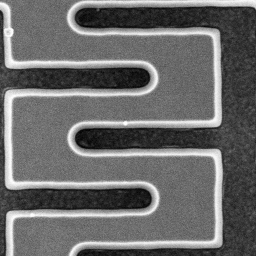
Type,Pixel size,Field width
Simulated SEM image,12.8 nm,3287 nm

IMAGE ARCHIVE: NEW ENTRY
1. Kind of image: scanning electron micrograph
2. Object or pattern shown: groups of lines, slits or small figures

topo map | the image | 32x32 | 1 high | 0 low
11111111111111111111111000000000
01111111100000000000000000000000
01111111100000000000000000000000
01111111110000000000000000000000
01111111111111111111111111100000
01111111111111111111111111100000
01111111111111111111111111100000
01111111111111111111111111100000
00000000000000000011111111100000
00000000000000000001111111100000
00000000000000000001111111100000
00011100111100111111111111100000
01111111111111111111111111100000
01111111111111111111111111100000
01111111111111111111111111100000
01111111111111111111111110000000
01111111100000000000000000000000
01111111100000000000000000000000
01111111110000000000000000000000
01111111111111111111111111100000
01111111111111111111111111100000
01111111111111111111111111100000
01111111111111111111111111100000
00000000000000000001111111100000
00000000000000000001111111100000
00000000000000000001111111100000
00000000000000000111111111100000
01111111111111111111111111100000
01111111111111111111111111100000
01111111111111111111111111100000
01111111111111111111111111100000
01111111100000000000000000000000